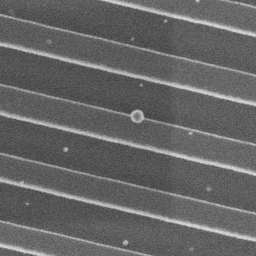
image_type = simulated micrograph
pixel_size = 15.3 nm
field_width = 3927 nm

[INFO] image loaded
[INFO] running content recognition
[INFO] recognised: lines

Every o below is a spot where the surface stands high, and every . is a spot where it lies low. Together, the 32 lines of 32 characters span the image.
...............ooooooooooooooo..
...................ooooooooooooo
ooo.....................oooooooo
ooooooo.....................oooo
ooooooooooo.....................
oooooooooooooooo................
....oooooooooooooooo............
........oooooooooooooooo........
............oooooooooooooooo....
.................ooooooooooooooo
.....................ooooooooooo
oooo.....................ooooooo
ooooooooo....................ooo
ooooooooooooo...................
.ooooooooooooooooo..............
.....oooooooooooooooo...........
..........ooooooooooooooo.......
..............oooooooooooooooo..
..................oooooooooooooo
oo....................oooooooooo
oooooo....................oooooo
oooooooooo.....................o
oooooooooooooo..................
....ooooooooooooooo.............
........ooooooooooooooo.........
............ooooooooooooooo.....
................ooooooooooooooo.
.....................ooooooooooo
oooo.....................ooooooo
oooooooo.....................ooo
ooooooooooooo...................
...oooooooooooooo...............